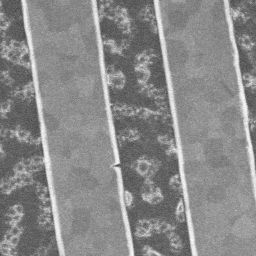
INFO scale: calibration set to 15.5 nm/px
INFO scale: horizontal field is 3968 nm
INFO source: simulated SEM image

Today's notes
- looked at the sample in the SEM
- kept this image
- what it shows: one or a few lines or trenches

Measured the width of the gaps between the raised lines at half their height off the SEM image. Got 969 nm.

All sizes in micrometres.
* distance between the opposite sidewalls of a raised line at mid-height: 1.08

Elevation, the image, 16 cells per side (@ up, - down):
--@@@@----@@@@--
--@@@@----@@@@--
--@@@@----@@@@@-
--@@@@----@@@@@-
--@@@@----@@@@@-
--@@@@@----@@@@-
--@@@@@----@@@@-
---@@@@----@@@@-
---@@@@----@@@@@
---@@@@----@@@@@
---@@@@----@@@@@
---@@@@@---@@@@@
---@@@@@----@@@@
---@@@@@----@@@@
----@@@@----@@@@
----@@@@----@@@@